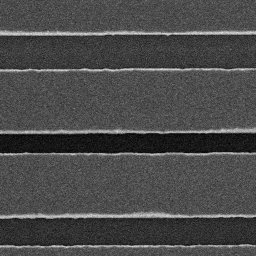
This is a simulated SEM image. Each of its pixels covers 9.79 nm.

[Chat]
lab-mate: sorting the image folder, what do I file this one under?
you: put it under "lines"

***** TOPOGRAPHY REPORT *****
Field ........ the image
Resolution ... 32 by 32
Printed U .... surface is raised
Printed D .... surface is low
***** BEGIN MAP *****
UUUUUUUUUUUUUUUUUUUUUUUUUUUUUUUU
UUUUUUUUUUUUUUUUUUUUUUUUUUUUUUUU
UUUUUUUUUUUUUUUUUUUUUUUUUUUUUUUU
UUUUUUUUUUUUUUUUUUUUUUUUUUUUUUUU
DDDDDDDDDDDDDDDDDDDDDDDDDDDDDDDD
DDDDDDDDDDDDDDDDDDDDDDDDDDDDDDDD
DDDDDDDDDDDDDDDDDDDDDDDDDDDDDDDD
DDDDDDDDDDDDDDDDDDDDDDDDDDDDDDDD
DDDDDDDDDDDDDDDDDDDDDDDDDDDDDDDD
UUUUUUUUUUUUUUUUUUUUUUUUUUUUUUUU
UUUUUUUUUUUUUUUUUUUUUUUUUUUUUUUU
UUUUUUUUUUUUUUUUUUUUUUUUUUUUUUUU
UUUUUUUUUUUUUUUUUUUUUUUUUUUUUUUU
UUUUUUUUUUUUUUUUUUUUUUUUUUUUUUUU
UUUUUUUUUUUUUUUUUUUUUUUUUUUUUUUU
UUUUUUUUUUUUUUUUUUUUUUUUUUUUUUUU
UUUUUUUUUUUUUUUUUUUUUUUUUUUUUUUU
DDDDDDDDDDDDDDDDDDDDDDDDDDDDDDDD
DDDDDDDDDDDDDDDDDDDDDDDDDDDDDDDD
UUUUUUUUUUUUUUUUUUUUUUUUUUUUUUUU
UUUUUUUUUUUUUUUUUUUUUUUUUUUUUUUU
UUUUUUUUUUUUUUUUUUUUUUUUUUUUUUUU
UUUUUUUUUUUUUUUUUUUUUUUUUUUUUUUU
UUUUUUUUUUUUUUUUUUUUUUUUUUUUUUUU
UUUUUUUUUUUUUUUUUUUUUUUUUUUUUUUU
UUUUUUUUUUUUUUUUUUUUUUUUUUUUUUUU
UUUUUUUUUUUUUUUUUUUUUUUUUUUUUUUU
DDDDDDDDDDDDDDDDDDDDDDDDDDDDDDDD
DDDDDDDDDDDDDDDDDDDDDDDDDDDDDDDD
DDDDDDDDDDDDDDDDDDDDDDDDDDDDDDDD
DDDDDDDDDDDDDDDDDDDDDDDDDDDDDDDD
UUUUUUUUUUUUUUUUUUUUUUUUUUUUUUUU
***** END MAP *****